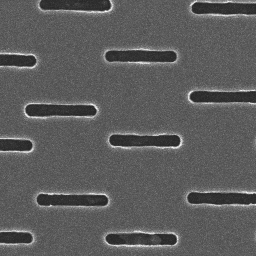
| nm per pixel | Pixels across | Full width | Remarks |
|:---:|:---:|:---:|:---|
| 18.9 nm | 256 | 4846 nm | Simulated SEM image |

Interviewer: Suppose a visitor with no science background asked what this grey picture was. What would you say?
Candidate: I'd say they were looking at holes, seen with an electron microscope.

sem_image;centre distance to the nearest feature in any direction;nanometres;1600